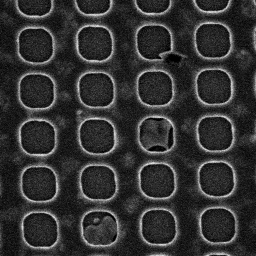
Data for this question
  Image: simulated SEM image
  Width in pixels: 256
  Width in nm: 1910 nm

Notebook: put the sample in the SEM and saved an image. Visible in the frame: a regular array of holes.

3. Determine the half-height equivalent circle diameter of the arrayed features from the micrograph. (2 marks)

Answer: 270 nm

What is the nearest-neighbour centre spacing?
0.344 µm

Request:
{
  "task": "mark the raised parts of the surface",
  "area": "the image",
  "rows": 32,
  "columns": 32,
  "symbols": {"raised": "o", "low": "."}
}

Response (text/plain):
oo....oooo....ooo....oooo...oooo
ooo...oooo...ooooo..oooooooooooo
oooooooooooooooooooooooooooooooo
oooooooooo...ooooo...oooo...oooo
oo....oooo....ooo....ooo.....ooo
oo.....ooo....ooo....oooo....ooo
oo.....ooo....ooo....oooo....ooo
ooo...ooooo..ooooooooooooooooooo
oooooooooooooooooooooooooooooooo
ooo...oooo....oooo...oooo....ooo
ooo....ooo....ooo.....ooo....ooo
oo.....ooo....ooo.....ooo....ooo
ooo....ooo....oooo...oooo....ooo
oooo.ooooooooooooooooooooooooooo
oooooooooooooooooooooooooooooooo
ooo...oooo....oooo...oooo....ooo
ooo....ooo....ooo.o...ooo....ooo
ooo....ooo....ooo.....ooo....ooo
ooo....oooo...oooo...ooooo..oooo
oooooooooooooooooooooooooooooooo
ooooooooooooooooooo.oooooo..oooo
ooo....ooo....oooo....ooo....ooo
ooo....ooo....oooo....ooo....ooo
ooo....ooo....oooo....ooo....ooo
ooo....oooo...ooooo..ooooo..oooo
oooooooooooooooooooooooooooooooo
oooooooooooo.ooooo...ooooo...ooo
ooo....ooo....oooo....ooo....ooo
ooo....ooo.....ooo....ooo....ooo
ooo....ooo..o..ooo....ooo....ooo
oooo...oooo.o.ooooo..ooooooooooo
oooooooooooooooooooooooooooooooo